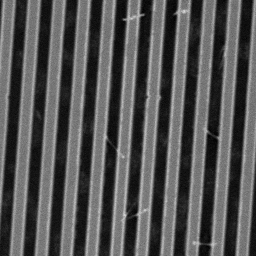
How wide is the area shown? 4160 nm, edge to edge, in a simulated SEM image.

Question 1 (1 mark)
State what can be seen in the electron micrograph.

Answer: parallel lines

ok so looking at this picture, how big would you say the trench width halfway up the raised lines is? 12.6 px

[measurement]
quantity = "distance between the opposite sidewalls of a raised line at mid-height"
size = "203 nanometres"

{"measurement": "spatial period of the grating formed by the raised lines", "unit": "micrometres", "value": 0.406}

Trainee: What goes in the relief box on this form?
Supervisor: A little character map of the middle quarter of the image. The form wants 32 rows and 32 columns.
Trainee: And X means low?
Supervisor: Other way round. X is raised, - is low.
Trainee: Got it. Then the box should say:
---XX----XXX---XXX---XXX----XX--
--XXX----XXX---XXX---XXX----XX--
--XXX----XXX---XXX---XXX----XX--
--XXX----XXX---XXX---XXX---XXX--
--XXX----XX----XXX---XXX---XXX--
--XXX---XXX----XX----XXX---XXX--
--XXX---XXX----XX----XXX---XXX--
--XXX---XXX----XX----XXX---XXX--
--XXX---XXX----XX----XXX---XXX--
--XXX---XXX---XXX----XXX---XXX--
--XXX---XXX---XXX---XXX----XXX--
--XXX---XXX---XXX---XXX----XXX--
--XXX---XXX---XXX---XXX----XXX--
--XXX---XXX---XXX---XXX----XX---
--XX----XXX---XXX---XXX----XX---
-XXX----XXX---XXX---XXX----XX---
-XXX----XXX---XXX---XXX----XX---
-XXX----XXX---XXX---XXX---XXX---
-XXX----XXX---XXX---XXX---XXX---
-XXX---XXX----XX----XXX---XXX---
-XXX---XXX----XX----XXX---XXX---
-XXX---XXX---XXX----XXX---XXX---
-XXX---XXX----XX----XXX---XXX---
-XXX---XXX---XXX----XX----XXX---
-XXX---XXX---XXX----XX----XXX---
-XXX---XXX---XXX----XX----XXX---
-XXX---XXX---XXX---XXX----XXX---
-XXX---XXX---XXX---XXX----XXX---
-XX----XXX---XXX---XXX----XX----
XXX----XXX---XXX---XXX----XX----
XXX----XXX---XXX---XXX----XX----
XXX----XXX---XXX---XXX---XXX----